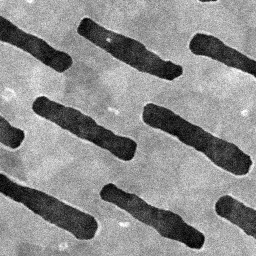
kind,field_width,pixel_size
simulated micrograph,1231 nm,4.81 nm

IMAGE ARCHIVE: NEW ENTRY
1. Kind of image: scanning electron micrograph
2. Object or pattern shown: holes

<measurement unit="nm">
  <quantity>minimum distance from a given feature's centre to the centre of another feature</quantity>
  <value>427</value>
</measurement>